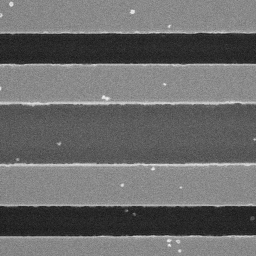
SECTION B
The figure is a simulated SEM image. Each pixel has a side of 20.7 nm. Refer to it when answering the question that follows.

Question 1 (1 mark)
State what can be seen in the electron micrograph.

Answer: lines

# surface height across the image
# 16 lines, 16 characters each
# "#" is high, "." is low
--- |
################
################
................
................
################
################
................
................
................
................
################
################
################
................
................
################